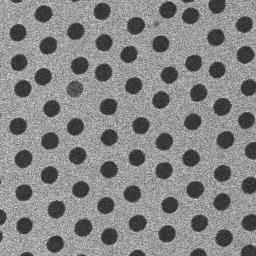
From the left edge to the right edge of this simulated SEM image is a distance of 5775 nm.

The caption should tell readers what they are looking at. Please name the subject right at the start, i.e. a regular array of holes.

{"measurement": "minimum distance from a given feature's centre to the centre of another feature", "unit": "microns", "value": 0.654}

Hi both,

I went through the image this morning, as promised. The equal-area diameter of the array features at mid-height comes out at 17.7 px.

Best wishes